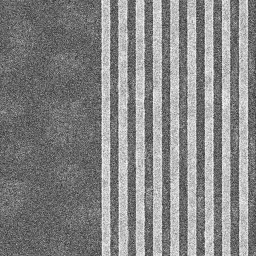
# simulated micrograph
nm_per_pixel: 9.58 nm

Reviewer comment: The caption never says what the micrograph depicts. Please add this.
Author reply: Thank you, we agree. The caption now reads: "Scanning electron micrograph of parallel lines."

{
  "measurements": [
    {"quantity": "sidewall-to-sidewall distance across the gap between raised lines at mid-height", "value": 89.8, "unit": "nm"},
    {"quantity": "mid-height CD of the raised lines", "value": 76.6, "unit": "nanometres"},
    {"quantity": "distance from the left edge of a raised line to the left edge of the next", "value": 164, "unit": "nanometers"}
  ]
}